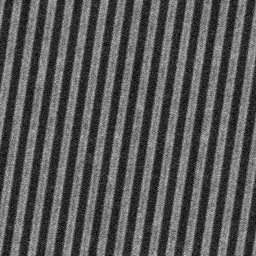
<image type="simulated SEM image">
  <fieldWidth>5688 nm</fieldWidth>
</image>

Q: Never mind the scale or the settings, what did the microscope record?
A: parallel lines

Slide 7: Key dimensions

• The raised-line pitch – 17.1 px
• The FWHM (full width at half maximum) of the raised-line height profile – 129 nanometers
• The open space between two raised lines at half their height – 256 nm